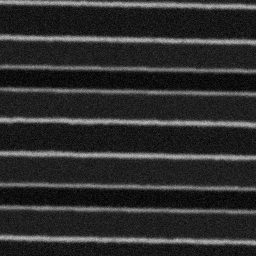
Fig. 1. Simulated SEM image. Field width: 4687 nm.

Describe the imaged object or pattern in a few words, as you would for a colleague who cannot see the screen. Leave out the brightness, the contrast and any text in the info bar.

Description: lines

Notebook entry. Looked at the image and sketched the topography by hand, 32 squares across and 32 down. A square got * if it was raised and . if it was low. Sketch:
.............*.*****************
................................
................................
................................
................................
********************************
********************************
********************************
...............*****************
................................
................................
***********.....................
********************************
********************************
********************************
...............................*
................................
................................
................................
**************..................
********************************
********************************
********************************
................................
................................
................................
*************************.......
********************************
********************************
********************************
................................
................................